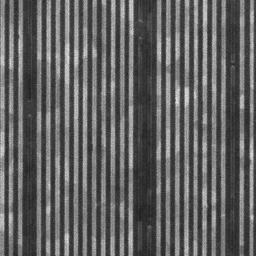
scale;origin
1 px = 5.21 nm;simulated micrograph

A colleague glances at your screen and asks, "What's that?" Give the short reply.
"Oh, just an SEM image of parallel lines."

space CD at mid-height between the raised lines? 33.8 nm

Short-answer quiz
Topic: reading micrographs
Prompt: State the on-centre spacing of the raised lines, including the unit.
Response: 48.1 nm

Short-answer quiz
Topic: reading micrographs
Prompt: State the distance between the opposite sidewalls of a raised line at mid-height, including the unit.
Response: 0.015 µm